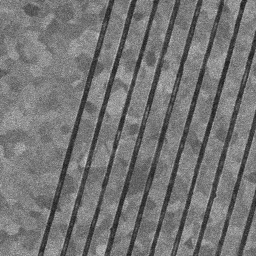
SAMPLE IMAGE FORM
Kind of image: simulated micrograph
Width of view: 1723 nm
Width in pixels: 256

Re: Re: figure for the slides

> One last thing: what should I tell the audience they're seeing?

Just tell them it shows parallel lines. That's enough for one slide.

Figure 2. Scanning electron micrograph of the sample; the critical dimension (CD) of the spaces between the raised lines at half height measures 0.0357 micrometres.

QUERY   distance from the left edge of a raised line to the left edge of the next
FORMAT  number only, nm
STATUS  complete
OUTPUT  144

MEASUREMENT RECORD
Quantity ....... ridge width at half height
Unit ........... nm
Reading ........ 107